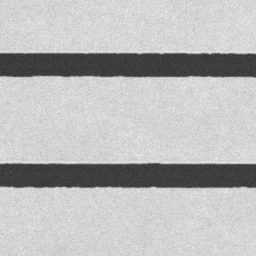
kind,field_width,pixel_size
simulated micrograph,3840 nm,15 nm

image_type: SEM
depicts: lines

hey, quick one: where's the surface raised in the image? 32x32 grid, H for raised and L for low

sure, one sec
HHHHHHHHHHHHHHHHHHHHHHHHHHHHHHHH
HHHHHHHHHHHHHHHHHHHHHHHHHHHHHHHH
HHHHHHHHHHHHHHHHHHHHHHHHHHHHHHHH
HHHHHHHHHHHHHHHHHHHHHHHHHHHHHHHH
HHHHHHHHHHHHHHHHHHHHHHHHHHHHHHHH
HHHHHHHHHHHHHHHHHHHHHHHHHHHHHHHH
HHHHHHHHHHHHHHHHHHHHHHHHHHHHHHHH
LLLLLLLLLLLLLLLLLLLLLLLLLLLLLLLL
LLLLLLLLLLLLLLLLLLLLLLLLLLLLLLLL
LLLLLLLLLLLLLLLLLLLLLLLLLLLLLLLL
HHHHHHHHHHHHHHHHHHHHHHHHHHHHHHHH
HHHHHHHHHHHHHHHHHHHHHHHHHHHHHHHH
HHHHHHHHHHHHHHHHHHHHHHHHHHHHHHHH
HHHHHHHHHHHHHHHHHHHHHHHHHHHHHHHH
HHHHHHHHHHHHHHHHHHHHHHHHHHHHHHHH
HHHHHHHHHHHHHHHHHHHHHHHHHHHHHHHH
HHHHHHHHHHHHHHHHHHHHHHHHHHHHHHHH
HHHHHHHHHHHHHHHHHHHHHHHHHHHHHHHH
HHHHHHHHHHHHHHHHHHHHHHHHHHHHHHHH
HHHHHHHHHHHHHHHHHHHHHHHHHHHHHHHH
LLLLLLLLLLLLLLLLLLLLLLLLLLLLLLLL
LLLLLLLLLLLLLLLLLLLLLLLLLLLLLLLL
LLLLLLLLLLLLLLLLLLLLLLLLLLLLLLLL
HHLHHHHHHHLLHHHLLLHHLLLLLLLLLLHL
HHHHHHHHHHHHHHHHHHHHHHHHHHHHHHHH
HHHHHHHHHHHHHHHHHHHHHHHHHHHHHHHH
HHHHHHHHHHHHHHHHHHHHHHHHHHHHHHHH
HHHHHHHHHHHHHHHHHHHHHHHHHHHHHHHH
HHHHHHHHHHHHHHHHHHHHHHHHHHHHHHHH
HHHHHHHHHHHHHHHHHHHHHHHHHHHHHHHH
HHHHHHHHHHHHHHHHHHHHHHHHHHHHHHHH
HHHHHHHHHHHHHHHHHHHHHHHHHHHHHHHH